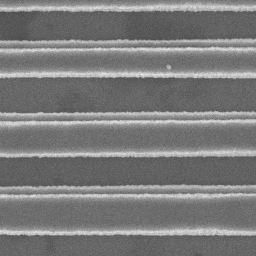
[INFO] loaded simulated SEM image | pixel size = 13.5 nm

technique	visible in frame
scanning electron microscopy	lines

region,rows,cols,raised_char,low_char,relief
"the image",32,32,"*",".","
********************************
................................
................................
................................
................................
................................
********************************
********************************
********************************
.........................**..***
................................
................................
................................
................................
................................
********************************
********************************
********************************
********************************
................................
................................
................................
................................
................................
********************************
********************************
********************************
********************************
********************************
................................
................................
................................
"